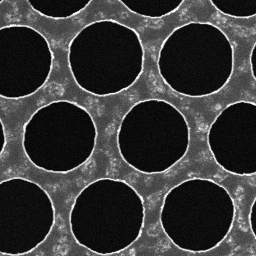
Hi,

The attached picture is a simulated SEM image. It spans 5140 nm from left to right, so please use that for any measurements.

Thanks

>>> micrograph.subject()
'holes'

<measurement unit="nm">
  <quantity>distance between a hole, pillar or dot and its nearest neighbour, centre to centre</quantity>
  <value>1810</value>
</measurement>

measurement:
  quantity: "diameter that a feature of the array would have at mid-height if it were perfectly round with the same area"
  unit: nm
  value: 1460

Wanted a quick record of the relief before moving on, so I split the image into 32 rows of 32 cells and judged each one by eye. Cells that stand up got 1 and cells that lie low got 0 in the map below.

11110000000111110000001111100000
11111000001111111000011111110000
11111111111111111111111111111111
10001111111000001111110000011111
00000111110000000111100000001111
00000011100000000011100000000111
00000011100000000011000000000111
00000011100000000011000000000110
00000011100000000011000000000111
00000011100000000111000000000111
00000111110000001111100000001111
00001111111000011111110000011111
11111111111111111111111111111111
11111000001111111000001111110000
11110000000111110000000111100000
11100000000011100000000111100000
11100000000011100000000111000000
01100000000011100000000011000000
11100000000011100000000111000000
11110000000111100000000111100000
11110000001111110000001111100000
11111111111111111100111111111000
11011111111110111111111101111111
00000111111000001111110000001111
00000011110000000111100000000111
00000011100000000011100000000111
00000001100000000011000000000110
00000001100000000011000000000110
00000011100000000011000000000110
00000011100000000111100000001111
00000111110000001111110000011111
00011111111100111111111111111111